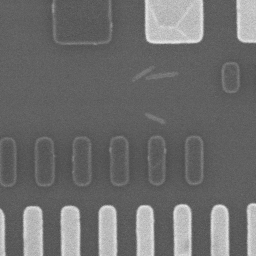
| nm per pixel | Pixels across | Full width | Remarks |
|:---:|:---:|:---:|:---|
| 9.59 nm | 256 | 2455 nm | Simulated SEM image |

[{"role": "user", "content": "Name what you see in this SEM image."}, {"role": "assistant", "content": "wiring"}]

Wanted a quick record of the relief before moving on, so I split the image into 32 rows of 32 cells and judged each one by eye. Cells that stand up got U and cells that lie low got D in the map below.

DDDDDDDUUUUUUUDDDDUUUUUUUDDDDDUU
DDDDDDDUUUUUUUDDDDUUUUUUUDDDDDUU
DDDDDDDUUUUUUUDDDDUUUUUUUDDDDDUU
DDDDDDDUUUUUUUDDDDUUUUUUUDDDDDUU
DDDDDDDUUUUUUUDDDDUUUUUUUDDDDDUU
DDDDDDDDDDDDDDDDDDDDDDDDDDDDDDDD
DDDDDDDDDDDDDDDDDDDDDDDDDDDDDDDD
DDDDDDDDDDDDDDDDDDDDDDDDDDDDDDDD
DDDDDDDDDDDDDDDDDDDDDDDDDDDDUUDD
DDDDDDDDDDDDDDDDDDDDDDDDDDDDUUDD
DDDDDDDDDDDDDDDDDDDDDDDDDDDDUUDD
DDDDDDDDDDDDDDDDDDDDDDDDDDDDDDDD
DDDDDDDDDDDDDDDDDDDDDDDDDDDDDDDD
DDDDDDDDDDDDDDDDDDDDDDDDDDDDDDDD
DDDDDDDDDDDDDDDDDDDDDDDDDDDDDDDD
DDDDDDDDDDDDDDDDDDDDDDDDDDDDDDDD
DDDDDDDDDDDDDDDDDDDDDDDDDDDDDDDD
UUDDDUDDDUUDDDUUDDDUDDDUUDDDDDDD
UUDDUUUDDUUDDDUUDDDUUDDUUDDDDDDD
UUDDUUUDDUUDDDUUDDDUUDDUUDDDDDDD
UUDDUUUDDUUDDDUUDDDUUDDUUDDDDDDD
UUDDDUUDDUUDDDUUDDDUUDDUUDDDDDDD
UUDDDUUDDUUDDDUUDDDUDDDUUDDDDDDD
DDDDDDDDDDDDDDDDDDDDDDDDDDDDDDDD
DDDDDDDDDDDDDDDDDDDDDDDDDDDDDDDD
DDDDDDDDDDDDDDDDDDDDDDDDDDDDDDDD
DDDUUDDDUUDDUUDDDUUDDDUUDDDUDDDU
UDDUUDDDUUDDUUDDDUUDDDUUDDDUDDDU
UDDUUDDDUUDDUUDDDUUDDDUUDDDUDDDU
UDDUUDDDUUDDUUDDDUUDDDUUDDDUDDDU
UDDUUDDDUUDDUUUDDUUDDDUUDDDUUDDU
UDDUUDDDUUDDUUUDDUUDDDUUDDDUUDDU